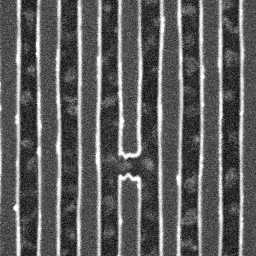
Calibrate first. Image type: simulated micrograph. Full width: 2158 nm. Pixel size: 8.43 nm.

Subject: parallel lines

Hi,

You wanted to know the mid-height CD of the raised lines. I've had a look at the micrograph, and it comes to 177 nm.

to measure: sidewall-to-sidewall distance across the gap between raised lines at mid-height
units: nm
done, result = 162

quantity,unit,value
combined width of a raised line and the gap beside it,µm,0.342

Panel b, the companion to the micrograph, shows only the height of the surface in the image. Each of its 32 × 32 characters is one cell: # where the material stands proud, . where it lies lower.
##...##...##...###..##...###..##
##...##...##...###..###..###..##
##...##...##...###..###..###..##
##...##...##...###..###..###..##
##...##...##...###..###..###..##
##...##...##...##...###..###..##
##...##...##...###..###..###..##
##...##...##...###..###..###..##
##...##...##...###..###..###..##
##...##...##...###..###..###..##
##...##...##...###..###..###..##
##...##...##...##...###..###..##
##...##...##...##...###..###..##
##...##...##...##...###..###..##
##...##...##...##...###..###..##
##...##...##...##...###..###..##
##...##...##...##...###..###..##
##...##...##...##...###..###..##
##...##...##...##...###..###..##
##...##...##........###..###..##
##...##...##........###..###..##
##...##...##........###..###..##
##...##...##...##...##...###..##
##...##...##...##...##...###..##
##...##...##...##...##...###..##
##...##...##...##...##...###..##
##...##...##...##...##...###..##
##...##...##...##...##...###..##
##...##...##...##...##...###..##
##...##...##...##...##...###..##
##...##...##...##...##...###..##
##...##...##...##...##...###..##